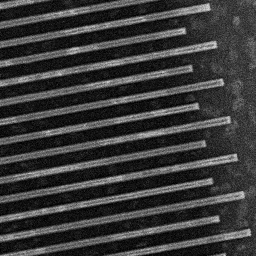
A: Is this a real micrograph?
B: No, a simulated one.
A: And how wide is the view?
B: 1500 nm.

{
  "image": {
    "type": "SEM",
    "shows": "parallel lines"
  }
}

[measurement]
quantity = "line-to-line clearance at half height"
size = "13.4 px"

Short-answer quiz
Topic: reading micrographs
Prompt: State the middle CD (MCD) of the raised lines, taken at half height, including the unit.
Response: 34.6 nanometers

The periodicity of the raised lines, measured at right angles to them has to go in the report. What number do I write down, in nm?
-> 112